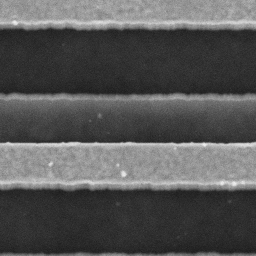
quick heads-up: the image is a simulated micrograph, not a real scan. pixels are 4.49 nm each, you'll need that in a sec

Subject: lines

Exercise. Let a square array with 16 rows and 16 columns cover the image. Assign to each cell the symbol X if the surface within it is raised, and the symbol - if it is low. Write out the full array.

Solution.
XXXXXXXXXXXXXXXX
XXXXXXXXXXXXXXXX
----------------
----------------
----------------
----------------
XXXXXXXXXXXXXXXX
XXXXXXXXXXXXXXXX
XXXXXXXXXXXXXXXX
XXXXXXXXXXXXXXXX
XXXXXXXXXXXXXXXX
XXXXXXXXXXXXXXXX
----------------
----------------
----------------
----------------